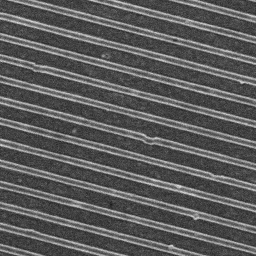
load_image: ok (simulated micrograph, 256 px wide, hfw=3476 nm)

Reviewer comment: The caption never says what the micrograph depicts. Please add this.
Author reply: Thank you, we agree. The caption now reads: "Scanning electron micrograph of parallel lines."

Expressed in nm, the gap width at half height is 194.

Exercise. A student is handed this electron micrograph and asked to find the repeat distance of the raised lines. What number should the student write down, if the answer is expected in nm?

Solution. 277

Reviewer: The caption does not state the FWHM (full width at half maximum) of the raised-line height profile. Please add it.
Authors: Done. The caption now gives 0.0805 micrometres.